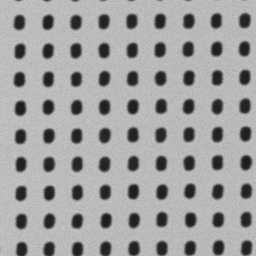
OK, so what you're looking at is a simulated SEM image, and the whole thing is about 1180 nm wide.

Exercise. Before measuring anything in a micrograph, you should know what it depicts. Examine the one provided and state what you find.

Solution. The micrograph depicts a regular array of holes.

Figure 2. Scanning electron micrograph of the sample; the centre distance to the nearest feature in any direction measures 129 nanometers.